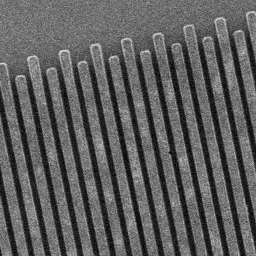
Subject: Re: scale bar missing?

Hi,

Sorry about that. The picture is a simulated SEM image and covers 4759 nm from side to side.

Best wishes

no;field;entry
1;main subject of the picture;parallel lines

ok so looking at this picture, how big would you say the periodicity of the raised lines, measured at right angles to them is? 15.9 px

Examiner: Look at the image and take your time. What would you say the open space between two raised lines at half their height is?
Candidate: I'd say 123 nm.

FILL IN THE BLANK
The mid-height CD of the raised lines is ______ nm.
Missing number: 173